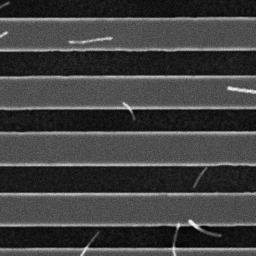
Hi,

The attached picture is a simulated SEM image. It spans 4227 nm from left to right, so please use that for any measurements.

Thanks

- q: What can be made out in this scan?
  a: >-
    lines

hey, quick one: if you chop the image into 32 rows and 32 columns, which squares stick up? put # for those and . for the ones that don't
................................
................................
################################
################################
################################
################################
................................
................................
................................
................................
################################
################################
################################
################################
................................
................................
................................
################################
################################
################################
################################
................................
................................
................................
################################
################################
################################
################################
................................
................................
................................
################################